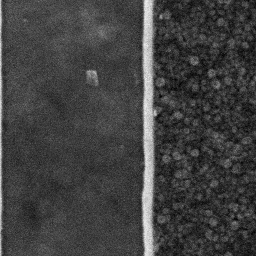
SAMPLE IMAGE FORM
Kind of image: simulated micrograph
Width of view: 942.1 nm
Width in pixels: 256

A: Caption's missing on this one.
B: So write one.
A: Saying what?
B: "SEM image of one or a few lines or trenches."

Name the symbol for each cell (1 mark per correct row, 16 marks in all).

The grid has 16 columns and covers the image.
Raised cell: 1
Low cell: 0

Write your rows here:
0000000001111111
0000000001111111
0000000001111111
0000000001111111
0000000001111111
0000000001111111
0000000001111111
0000000001111111
0000000001111111
0000000001111111
0000000001111111
0000000001111111
0000000001111111
0000000001111111
0000000001111111
0000000001111111